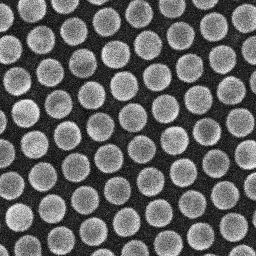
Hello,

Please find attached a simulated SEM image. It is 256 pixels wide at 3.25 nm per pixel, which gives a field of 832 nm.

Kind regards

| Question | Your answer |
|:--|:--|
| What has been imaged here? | a regular array of raised bodies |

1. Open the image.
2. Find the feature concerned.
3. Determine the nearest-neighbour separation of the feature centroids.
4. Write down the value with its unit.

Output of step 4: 107 nanometers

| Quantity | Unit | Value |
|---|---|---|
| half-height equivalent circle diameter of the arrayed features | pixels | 27.1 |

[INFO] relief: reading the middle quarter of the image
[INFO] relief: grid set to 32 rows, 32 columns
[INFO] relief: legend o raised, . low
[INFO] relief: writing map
.ooooooo...oooo.......ooo...oooo
..oooooo.............ooooo..oooo
...oooo......oooo...ooooooo.oooo
............oooooo..ooooooo..ooo
............oooooo..oooooo......
.....oooo...oooooo...ooooo......
....oooooo..oooooo....oo.......o
o...oooooo..oooooo.............o
oo..oooooo...oooo......oooo...oo
oo..oooooo.............ooooo..oo
oo...oooo.......ooo...ooooooo..o
oo.............ooooo..ooooooo..o
o.......oo....oooooo..oooooo....
.......ooooo..ooooooo..ooooo....
......oooooo..oooooo....oo......
ooo...oooooo...ooooo............
oooo..oooooo....ooo.......oooo..
oooo..oooooo.............oooooo.
oooo...oooo.......ooo...ooooooo.
oooo.............ooooo...oooooo.
ooo.......ooo...ooooooo..oooooo.
.........ooooo..ooooooo..ooooo..
..oo....oooooo..ooooooo....o....
.ooooo..ooooooo..ooooo..........
oooooo..oooooo....ooo.......oooo
oooooo..oooooo.............ooooo
oooooo...oooo.......ooo....ooooo
oooooo.............oooooo..ooooo
.oooo.......ooo...ooooooo..ooooo
...........ooooo..ooooooo..ooooo
..........ooooooo..oooooo....o..
...oooo...ooooooo..ooooo........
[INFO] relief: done